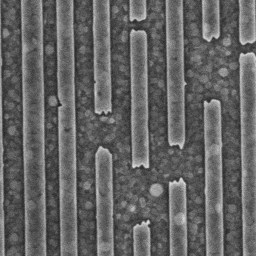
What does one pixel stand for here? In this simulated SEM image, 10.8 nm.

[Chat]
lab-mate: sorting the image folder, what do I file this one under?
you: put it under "parallel lines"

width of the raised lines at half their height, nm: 175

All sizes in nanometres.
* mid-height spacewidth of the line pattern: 220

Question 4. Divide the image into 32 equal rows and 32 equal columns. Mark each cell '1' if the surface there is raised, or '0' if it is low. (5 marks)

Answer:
00011001100011001100011001100011
00011001100011001100011001100011
00011001100011000000011001100011
00011001100011000000011001100011
00011001100011001100011001100011
00011001100011001100011000000000
00011001100011001100011000000000
00011001100011001100011000000011
00011001100011001100011000000011
00011001100011001100011000000011
00011001100011001100011000000011
00011001100011001100011000000011
00011011100011001100011000000011
00011001100011001100011000100011
00011001100000000100011000100011
00011001100000000100011000110011
00011001100000000100011000110011
00011001100000000100011000110011
00011001100000001100000000110011
00011101100011000110000000110011
00011101100011000110000000110011
00011101100011000000000000110011
00011101100011000000000000110011
00011101100011000001011000110011
00011100100011000000011000110011
00011100100011000000011000110011
00011100100011000000011000110011
00011100110011000000011000110011
00011100110011000110011000110011
00011100110011000110011000110011
00011100110011000110011000110011
00011100110011000110011000110011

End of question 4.